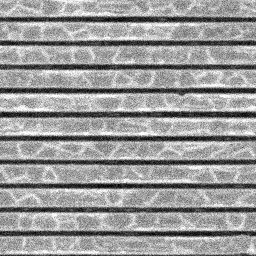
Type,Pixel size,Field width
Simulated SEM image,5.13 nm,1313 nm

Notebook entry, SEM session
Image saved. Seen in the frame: parallel lines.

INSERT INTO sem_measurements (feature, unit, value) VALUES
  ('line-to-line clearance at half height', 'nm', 33.3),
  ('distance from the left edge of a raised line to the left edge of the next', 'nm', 122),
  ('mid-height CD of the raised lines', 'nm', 90.4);